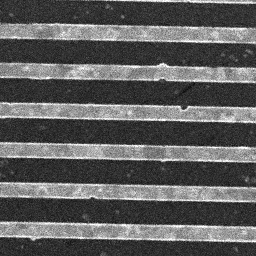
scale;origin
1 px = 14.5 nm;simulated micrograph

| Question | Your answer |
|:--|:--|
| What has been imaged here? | parallel lines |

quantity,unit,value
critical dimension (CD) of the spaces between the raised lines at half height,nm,380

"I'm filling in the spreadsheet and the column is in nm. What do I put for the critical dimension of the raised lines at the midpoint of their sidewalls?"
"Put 197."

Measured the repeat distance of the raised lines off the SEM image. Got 575 nanometres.